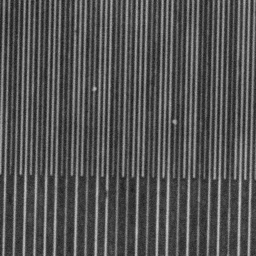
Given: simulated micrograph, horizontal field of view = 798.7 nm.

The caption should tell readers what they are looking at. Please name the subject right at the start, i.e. parallel lines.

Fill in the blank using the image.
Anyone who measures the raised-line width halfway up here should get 5.9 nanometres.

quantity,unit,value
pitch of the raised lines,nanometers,16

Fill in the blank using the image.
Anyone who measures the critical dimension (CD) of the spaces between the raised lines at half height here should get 12.1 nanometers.